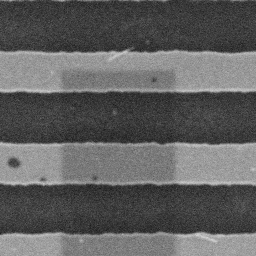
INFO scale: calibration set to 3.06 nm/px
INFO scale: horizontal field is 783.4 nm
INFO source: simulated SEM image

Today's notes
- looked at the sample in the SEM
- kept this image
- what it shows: lines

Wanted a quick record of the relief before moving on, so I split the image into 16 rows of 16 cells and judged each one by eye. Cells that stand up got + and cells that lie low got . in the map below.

................
................
................
++++++++++++++++
++++++++++++++++
++++++++++++++++
................
................
................
++++++++++++++++
++++++++++++++++
++++++++++++++++
................
................
................
++++++++++++++++